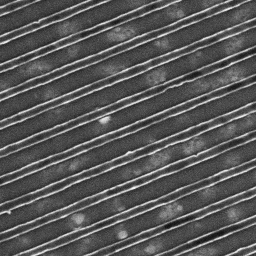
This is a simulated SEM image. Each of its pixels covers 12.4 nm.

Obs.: parallel lines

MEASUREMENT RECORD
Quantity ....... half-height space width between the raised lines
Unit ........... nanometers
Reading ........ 226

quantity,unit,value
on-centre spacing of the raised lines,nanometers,324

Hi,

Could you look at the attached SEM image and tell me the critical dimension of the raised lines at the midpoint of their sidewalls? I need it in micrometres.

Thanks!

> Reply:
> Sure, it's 0.0992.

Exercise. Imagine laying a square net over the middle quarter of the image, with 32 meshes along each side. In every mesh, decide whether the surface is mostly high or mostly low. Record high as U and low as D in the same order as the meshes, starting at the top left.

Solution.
UUUUUUDDDDDDDDDDDDUUUUUDDDDDDDDD
UUUDDDDDDDDDDDDUUUUUUDDDDDDDDDDD
UDDDDDDDDDDDDUUUUUUDDDDDDDDDDDDU
DDDDDDDDDDDUUUUUDDDDDDDDDDDDUUUU
DDDDDDDDUUUUUDDDDDDDDDDDDDUUUUDD
DDDDDDUUUUUDDDDDDDDDDDDUUUUUDDDD
DDDUUUUUDDDDDDDDDDDDDUUUUDDDDDDD
DUUUUUDDDDDDDDDDDDUUUUUUDDDDDDDD
UUUDDDDDDDDDDDDUUUUUUDDDDDDDDDDD
UDDDDDDDDDDDDUUUUUUDDDDDDDDDDDUU
DDDDDDDDDDDUUUUUDDDDDDDDDDDDUUUU
DDDDDDDDUUUUUUDDDDDDDDDDDUUUUUUD
DDDDDDUUUUUDDDDDDDDDDDDUUUUUUDDD
DDDUUUUUUUUDDDDDDDDDDUUUUUDDDDDD
DUUUUUDDDDUDDDDDDDUUUUUDDDDDDDDD
UUUUDDDDDDDDDDDDUUUUUDDDDDDDDDDD
UDDDDDDDDDDDDUUUUUUDDDDDDDDDDDDU
DDDDDDDDDDDUUUUUDDDDDDDDDDDDUUUU
DDDDDDDDUUUUUUDDDDDDDDDDDDUUUUUU
DDDDDDUUUUUDDDDDDDDDDDDUUUUUUDDD
DDDUUUUUDDDDDDDDDDDDDUUUUUDDDDDD
DUUUUUDDDDDDDDDDDDUUUUUUDDDDDDDD
UUUDDDDDDDDDDDDUUUUUUUDDDDDDDDDD
UDDDDDDDDDDDDUUUUUUDDDDDDDDDDDDU
DDDDDDDDDDDUUUUUDDDDDDDDDDDDUUUU
DDDDDDDDUUUUUUDDDDDDDDDDDDUUUUUU
DDDDDDUUUUUDDDDDDDDDDDDUUUUUUDDD
DDDUUUUUUDDDDDDDDDDDDUUUUUUDDDDD
DUUUUUDDDDDDDDDDDDUUUUUUDDDDDDDD
UUUUDDDDDDDDDDDDUUUUUDDDDDDDDDDD
UDDDDDDDDDDDDUUUUUUDDDDDDDDDDDDU
DDDDDDDDDDDUUUUUDDDDDDDDDDDDUUUU